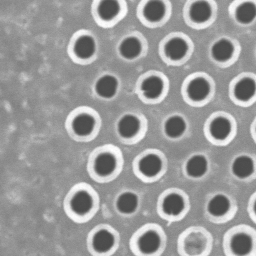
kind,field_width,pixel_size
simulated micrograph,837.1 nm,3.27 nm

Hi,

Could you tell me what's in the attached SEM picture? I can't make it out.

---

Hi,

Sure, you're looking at a regular array of holes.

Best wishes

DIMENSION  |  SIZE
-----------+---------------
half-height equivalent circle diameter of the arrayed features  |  0.0708 microns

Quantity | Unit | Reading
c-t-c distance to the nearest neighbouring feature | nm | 146